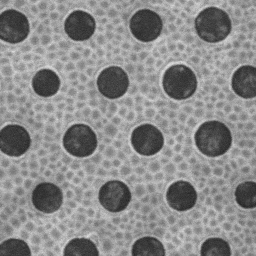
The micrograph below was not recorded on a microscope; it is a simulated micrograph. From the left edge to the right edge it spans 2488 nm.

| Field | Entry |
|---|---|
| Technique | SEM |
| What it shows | a regular array of holes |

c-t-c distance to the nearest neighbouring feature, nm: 638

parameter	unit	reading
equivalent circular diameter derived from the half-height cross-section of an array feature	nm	322